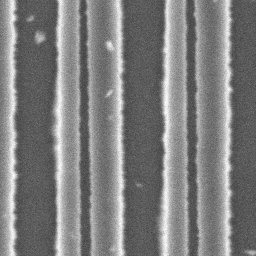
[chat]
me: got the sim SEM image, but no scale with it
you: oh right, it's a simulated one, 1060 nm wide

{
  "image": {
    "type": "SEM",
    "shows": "lines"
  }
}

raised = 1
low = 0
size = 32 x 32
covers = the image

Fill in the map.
11000000111111100000011111110000
11000001111111100000011111110000
11000001111111100000011111111000
11000001111111100000011111110000
11000001111111100000011111110000
11000001111111100000011111110000
11000001111111100000011111110000
11000001111111100000011111110000
11000001111111100000011111110000
11000001111111100000011111111000
11000001111111100000011111110000
11000001111111100000011111111000
11000001111111100000011111110000
11000001111111100000011111111000
11000001111111100000011111111000
11000001111111100000011111110000
11000001111111100000011111111000
11000001111111100000011111111000
11000001111111100000011111110000
11000001111111100000011111110000
11000001111111100000011111110000
11000001111111100000011111110000
11000001111111100000011111110000
11000001111111100000011111110000
11000001111111100000011111110000
11000001111111100000011111110000
10000001111111100000011111110000
11000001111111100000011111110000
11000001111111100000111111110000
11000001111111100000011111110000
11000001111111100000011111110000
11000001111111100000011111110000